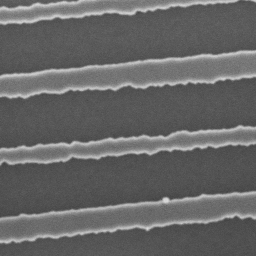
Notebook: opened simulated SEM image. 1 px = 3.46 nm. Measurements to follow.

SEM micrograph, lines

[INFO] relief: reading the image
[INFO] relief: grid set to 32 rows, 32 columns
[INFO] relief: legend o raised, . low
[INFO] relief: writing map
....o.oooooooooooooooooo.o......
ooooooooooooooooo...............
ooooo...........................
................................
................................
................................
..............................oo
....................oooooooooooo
..........oooooooooooooooooooooo
oooooooooooooooooooooooooooooooo
oooooooooooooooooooooo..........
oooooooo........................
................................
................................
................................
................................
......................oooooooooo
.............ooooooooooooooooooo
..oooooooooooooooooooooo........
ooooooooooooo...................
.o..............................
................................
................................
................................
.........................ooooooo
.................ooooooooooooooo
......oooooooooooooooooooooooooo
ooooooooooooooooooooooooooo.....
ooooooooooooooooo.o.............
ooooooooo.......................
................................
................................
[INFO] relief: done